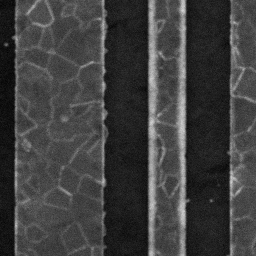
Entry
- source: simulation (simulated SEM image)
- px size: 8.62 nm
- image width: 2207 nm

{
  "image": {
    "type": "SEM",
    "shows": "lines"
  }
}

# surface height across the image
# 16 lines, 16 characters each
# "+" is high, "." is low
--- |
.+++++...+++..++
.+++++...+++..++
.+++++...+++..++
.+++++...+++..++
.+++++...+++..++
.+++++...+++..++
.+++++...+++..++
.+++++...+++..++
.+++++...+++..++
.+++++...+++..++
.+++++...+++..++
.+++++...+++..++
.+++++...+++..++
.+++++...+++..++
.+++++...+++..++
.+++++...+++..++